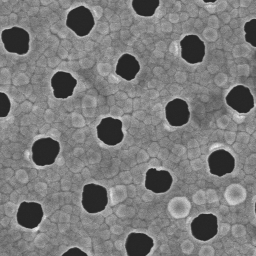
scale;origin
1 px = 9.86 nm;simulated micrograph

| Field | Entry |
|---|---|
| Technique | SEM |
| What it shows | a regular array of holes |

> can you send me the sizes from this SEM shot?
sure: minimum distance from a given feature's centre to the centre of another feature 644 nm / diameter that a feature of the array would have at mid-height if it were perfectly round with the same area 26.9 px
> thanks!